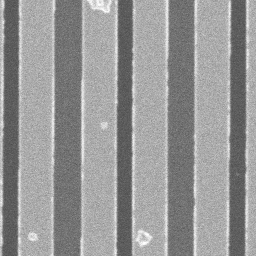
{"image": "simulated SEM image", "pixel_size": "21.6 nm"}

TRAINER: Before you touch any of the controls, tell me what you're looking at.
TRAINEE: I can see lines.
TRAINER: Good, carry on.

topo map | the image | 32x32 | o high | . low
..ooooo...ooooo..oooo...ooooo..o
..ooooo...ooooo..oooo...ooooo..o
..ooooo...ooooo..oooo...ooooo..o
..ooooo...ooooo..oooo...ooooo..o
..ooooo...ooooo..oooo...ooooo..o
..ooooo...ooooo..oooo...ooooo..o
..ooooo...ooooo..oooo...ooooo..o
..ooooo...ooooo..oooo...ooooo..o
..ooooo...ooooo..oooo...ooooo..o
..ooooo...ooooo..oooo...ooooo..o
..ooooo...ooooo..oooo...ooooo..o
..ooooo...ooooo..oooo...ooooo..o
..ooooo...ooooo..oooo...ooooo..o
..ooooo...oooo...oooo...ooooo..o
..ooooo...oooo...oooo...ooooo..o
..ooooo...oooo...oooo...ooooo..o
..ooooo...oooo...oooo...ooooo..o
..ooooo...oooo...oooo...ooooo..o
..ooooo...oooo...oooo...ooooo..o
..ooooo...oooo...oooo...ooooo..o
..ooooo...oooo...oooo...ooooo..o
..ooooo...oooo...oooo...ooooo..o
..ooooo...oooo...oooo...ooooo..o
..ooooo...oooo...oooo...ooooo..o
..ooooo...oooo...oooo...ooooo..o
..ooooo...oooo...oooo...ooooo..o
..ooooo...oooo...oooo...ooooo..o
..ooooo...oooo...oooo...ooooo..o
..ooooo...oooo...oooo...ooooo..o
..ooooo...oooo...oooo...ooooo..o
..ooooo...oooo...oooo...ooooo..o
..ooooo...oooo...oooo...ooooo..o